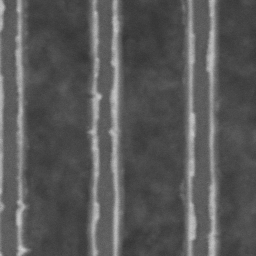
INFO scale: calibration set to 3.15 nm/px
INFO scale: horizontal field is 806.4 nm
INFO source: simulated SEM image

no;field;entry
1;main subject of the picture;one or a few lines or trenches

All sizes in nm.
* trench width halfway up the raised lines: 232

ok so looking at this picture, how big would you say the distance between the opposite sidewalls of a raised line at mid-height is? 0.0709 microns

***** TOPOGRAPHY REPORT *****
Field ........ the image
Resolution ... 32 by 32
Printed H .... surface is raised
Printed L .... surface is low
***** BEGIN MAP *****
HHLLLLLLLLLLHHLLLLLLLLLLHHHLLLLL
HHLLLLLLLLLLHHLLLLLLLLLLHHHLLLLL
HHLLLLLLLLLLHHHLLLLLLLLLHHHLLLLL
HHLLLLLLLLLLHHHLLLLLLLLLHHHLLLLL
HHLLLLLLLLLLHHHLLLLLLLLLHHHLLLLL
HHHLLLLLLLLLHHLLLLLLLLLLHHHLLLLL
HHHLLLLLLLLLHHLLLLLLLLLLHHHLLLLL
HHHLLLLLLLLLHHHLLLLLLLLLHHHLLLLL
HHHLLLLLLLLLHHHLLLLLLLLLHHLLLLLL
HHHLLLLLLLLLHHLLLLLLLLLLHHLLLLLL
HHHLLLLLLLLLHHLLLLLLLLLLHHLLLLLL
HHHLLLLLLLLLHHLLLLLLLLLLHHLLLLLL
HHHLLLLLLLLLHHLLLLLLLLLLHHLLLLLL
HHHLLLLLLLLLHHLLLLLLLLLLHHLLLLLL
HHHLLLLLLLLLHHLLLLLLLLLLHHLLLLLL
HHHLLLLLLLLLHHLLLLLLLLLLHHLLLLLL
HHHLLLLLLLLLHHLLLLLLLLLLHHLLLLLL
HHHLLLLLLLLLHHLLLLLLLLLLHHLLLLLL
HHHLLLLLLLLLHHLLLLLLLLLLHHLLLLLL
HHHLLLLLLLLLHHLLLLLLLLLLHHHLLLLL
HHHLLLLLLLLLHHLLLLLLLLLLHHHLLLLL
HHHLLLLLLLLLHHLLLLLLLLLLHHHLLLLL
HHHLLLLLLLLLHHLLLLLLLLLLHHHLLLLL
HHHLLLLLLLLLHHLLLLLLLLLLHHHLLLLL
HHHLLLLLLLLLHHLLLLLLLLLLHHHLLLLL
HHHLLLLLLLLLHHLLLLLLLLLLHHHLLLLL
HHHLLLLLLLLLHHLLLLLLLLLLHHHLLLLL
HHHLLLLLLLLLHHLLLLLLLLLLHHHLLLLL
HHLLLLLLLLLLHHLLLLLLLLLLHHHLLLLL
HHLLLLLLLLLLHHLLLLLLLLLLHHHLLLLL
HHHLLLLLLLLLHHLLLLLLLLLLHHHLLLLL
HHHLLLLLLLLLHHLLLLLLLLLLHHHLLLLL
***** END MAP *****